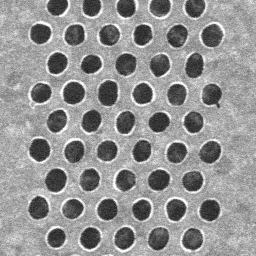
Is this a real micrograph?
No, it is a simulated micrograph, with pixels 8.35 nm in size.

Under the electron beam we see a regular array of holes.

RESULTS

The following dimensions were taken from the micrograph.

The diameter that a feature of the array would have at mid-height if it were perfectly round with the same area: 189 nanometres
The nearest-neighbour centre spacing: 0.276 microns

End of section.